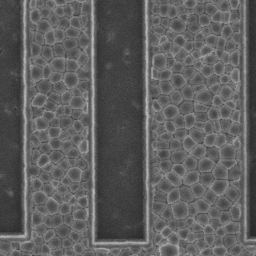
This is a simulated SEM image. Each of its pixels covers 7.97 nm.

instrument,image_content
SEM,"one or a few lines or trenches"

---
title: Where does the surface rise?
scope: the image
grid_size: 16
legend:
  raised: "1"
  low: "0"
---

0011110001111110
0011110001111110
0011110001111110
0011110001111110
0011110001111110
0011110001111110
0011110001111110
0011110001111110
0011110001111110
0011110001111110
0011110001111110
0011110001111110
0011110001111110
0011110001111110
0111110001111110
1111111111111111